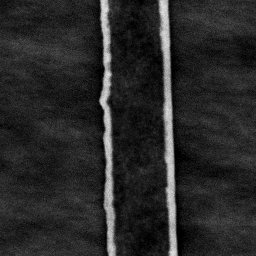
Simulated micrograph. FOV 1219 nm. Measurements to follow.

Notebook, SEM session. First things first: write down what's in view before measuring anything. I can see one or a few lines or trenches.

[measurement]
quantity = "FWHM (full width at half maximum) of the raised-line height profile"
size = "294 nm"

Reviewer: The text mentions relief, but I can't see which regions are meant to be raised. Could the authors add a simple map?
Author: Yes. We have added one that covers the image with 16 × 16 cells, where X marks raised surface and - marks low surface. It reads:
------XXXX------
------XXXX------
-------XXX------
-------XXX------
-------XXX------
-------XXX------
------XXXX------
-------XXXX-----
-------XXXX-----
-------XXXX-----
-------XXXX-----
-------XXXX-----
-------XXXX-----
-------XXXX-----
-------XXXX-----
-------XXXX-----